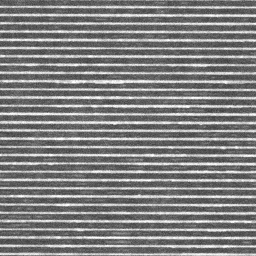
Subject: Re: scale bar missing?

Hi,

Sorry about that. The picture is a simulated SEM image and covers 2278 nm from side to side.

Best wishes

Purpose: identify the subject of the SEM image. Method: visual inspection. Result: parallel lines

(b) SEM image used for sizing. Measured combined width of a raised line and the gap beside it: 73.3 nm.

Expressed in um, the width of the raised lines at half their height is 0.0167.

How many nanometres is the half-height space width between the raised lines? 60.1